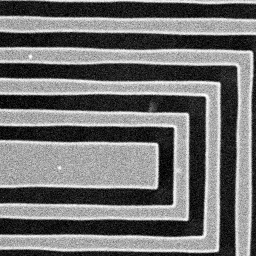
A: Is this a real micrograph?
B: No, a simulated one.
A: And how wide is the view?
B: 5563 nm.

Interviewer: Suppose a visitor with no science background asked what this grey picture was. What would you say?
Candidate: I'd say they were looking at groups of lines, slits or small figures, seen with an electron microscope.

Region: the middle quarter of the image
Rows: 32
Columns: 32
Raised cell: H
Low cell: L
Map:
LLLLLLLLLLLLLLLLLLLLLLLLLLLLLLLL
LLLLLLLLLLLLLLLLLLLLLLLLLLLLLLLL
LLLLLLLLLLLLLLLLLLLLLLLLLLLLLLLL
LLLLLLLLLLLLLLLLLLLLLLLLLLLLLLLL
HHHHHHHHHHHHLLLLLLLLLHHHHHHHLHHH
HHHHHHHHHHHHHHHHHHHHHHHHHHHHHHHH
HHHHHHHHHHHHHHHHHHHHHHHHHHHHHHHH
HHHHLLLLLLLLLLLLLLLLLLLHHHHHHHHH
LLLLLLLLLLLLLLLLLLLLLLLLLLLLLLLL
LLLLLLLLLLLLLLLLLLLLLLLLLLLLLLLL
LLLLLLLLLLLLLLLLLLLLLLLLLLLLLLLL
LLLLLLLLLLLLLLLLLLLLLLLLLLLLLLLL
HHHHHHHHHHHHHHHHHHHHHHHHHHHHHHHL
HHHHHHHHHHHHHHHHHHHHHHHHHHHHHHHL
HHHHHHHHHHHHHHHHHHHHHHHHHHHHHHHL
LLLLLLLLLLLLLLHHHHHLLLHHHHHHHHHL
LLLLLLLLLLLLLLLLLLLLLLLLLLLLHHHL
LLLLLLLLLLLLLLLLLLLLLLLLLLLLHHHL
LLLLLLLLLLLLLLLLLLLLLLLLLLLLHHHL
LLLLLLLLLLLLLLLLLLLLLLLLLLLLHHHL
HHHHHHHHHHHHHHHHHHHHHHHLLLLLHHHL
HHHHHHHHHHHHHHHHHHHHHHHLLLLLHHHL
HHHHHHHHHHHHHHHHHHHHHHHLLLLLHHHL
HHHHHHHHHHHHHHHHHHHHHHHLLLLLHHHL
HHHHHHHHHHHHHHHHHHHHHHHLLLLLHHHL
HHHHHHHHHHHHHHHHHHHHHHHLLLLLHHHL
HHHHHHHHHHHHHHHHHHHHHHHLLLLLHHHL
HHHHHHHHHHHHHHHHHHHHHHHLLLLLHHHL
HHHHHHHHHHHHHHHHHHHHHHHLLLLLHHHL
HHHHHHHHHHHHHHHHHHHHHHHLLLLLHHHL
HHHHHHHHHHHHHHHHHHHHHHHLLLLLHHHL
LLLLLLLLLLLLLLLLLLLLLLLLLLLLHHHL